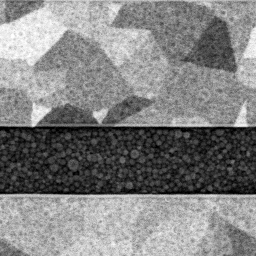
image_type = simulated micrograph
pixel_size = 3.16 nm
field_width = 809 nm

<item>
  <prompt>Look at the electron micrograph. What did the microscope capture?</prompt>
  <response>one or a few lines or trenches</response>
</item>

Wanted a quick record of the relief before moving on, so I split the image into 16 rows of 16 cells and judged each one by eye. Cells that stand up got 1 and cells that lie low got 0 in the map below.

1111111111111111
1111111111111111
1111111111111111
1111111111111111
1111111111111111
1111111111111111
1111111111111111
1111111111111111
0000000000000000
0000000000000000
0000000000000000
0000000000000000
1111111111111111
1111111111111111
1111111111111111
1111111111111111